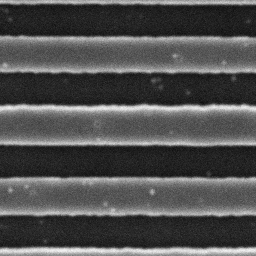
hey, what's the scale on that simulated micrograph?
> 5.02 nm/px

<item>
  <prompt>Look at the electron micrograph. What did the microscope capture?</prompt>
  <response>lines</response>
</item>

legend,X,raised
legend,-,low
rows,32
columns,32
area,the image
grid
------------------------------X-
--------------------------------
--------------------------------
--------------------------------
--------------------------------
XXXXXXXXXXXXXXXXXXXXXXXXXXXXXXXX
XXXXXXXXXXXXXXXXXXXXXXXXXXXXXXXX
XXXXXXXXXXXXXXXXXXXXXXXXXXXXXXXX
XXXXXXXXXXXXXXXXXXXXXXXXXXXXXXXX
--------------------------------
--------------------------------
--------------------------------
--------------------------------
XXXXXXXXXXXXXXXXXXXXXXXXXXXXXXXX
XXXXXXXXXXXXXXXXXXXXXXXXXXXXXXXX
XXXXXXXXXXXXXXXXXXXXXXXXXXXXXXXX
XXXXXXXXXXXXXXXXXXXXXXXXXXXXXXXX
XXXXXXXXXXXXXXXXXXXXXXXXXXXXXXXX
--------------------------------
--------------------------------
--------------------------------
--------------------------------
XXXXXXXXXXXXXXXXXXXXXXXXXXXXXXXX
XXXXXXXXXXXXXXXXXXXXXXXXXXXXXXXX
XXXXXXXXXXXXXXXXXXXXXXXXXXXXXXXX
XXXXXXXXXXXXXXXXXXXXXXXXXXXXXXXX
XXXXXXXXXXXXXXXXXXXXXXXXXXXXXXXX
--------------------------------
--------------------------------
--------------------------------
--------------------------------
XXXXXXXXXXXXXXXXXXXXXXXXXXXXXXXX